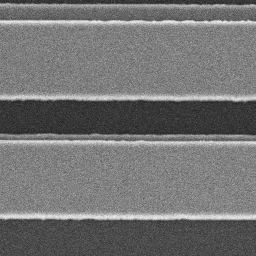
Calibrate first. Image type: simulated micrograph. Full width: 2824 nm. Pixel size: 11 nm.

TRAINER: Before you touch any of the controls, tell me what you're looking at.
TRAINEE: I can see lines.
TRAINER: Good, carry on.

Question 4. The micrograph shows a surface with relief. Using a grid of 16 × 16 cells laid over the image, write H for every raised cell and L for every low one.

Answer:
HHHHHHHHHHHHHHHH
HHHHHHHHHHHHHHHH
HHHHHHHHHHHHHHHH
HHHHHHHHHHHHHHHH
HHHHHHHHHHHHHHHH
HHHHHHHHHHHHHHHH
LLLLLLLLLLLLLLLL
LLLLLLLLLLLLLLLL
HHHHHHHHHHHHHHHH
HHHHHHHHHHHHHHHH
HHHHHHHHHHHHHHHH
HHHHHHHHHHHHHHHH
HHHHHHHHHHHHHHHH
HHHHHHHHHHHHHHHH
LLLLLLLLLLLLLLLL
LLLLLLLLLLLLLLLL